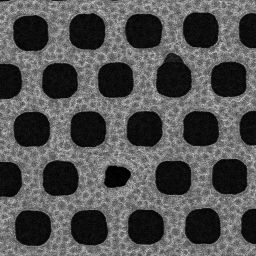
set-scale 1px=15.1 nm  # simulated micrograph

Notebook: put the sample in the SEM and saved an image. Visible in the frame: a regular array of holes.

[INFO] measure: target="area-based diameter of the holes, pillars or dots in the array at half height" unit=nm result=567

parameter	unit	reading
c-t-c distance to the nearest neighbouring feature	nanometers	843